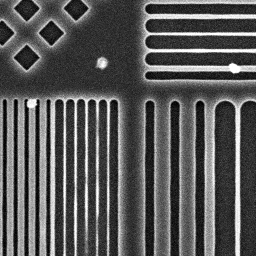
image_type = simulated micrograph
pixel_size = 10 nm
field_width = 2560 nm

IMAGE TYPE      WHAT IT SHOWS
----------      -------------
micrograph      groups of lines, slits or small figures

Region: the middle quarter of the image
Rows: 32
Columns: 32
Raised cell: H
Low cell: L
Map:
HHHHHHHHHHHHHHHHHHHHHHLLLLLLLLLL
HHHHHHHHHHHHHHHHHHHHHHHHHHHHHHHH
HHHHHHHHHHHHHHHHHHHHLLLLLLLLLLLL
HHHHHHHHHHHHHHHHHHHHLLLLLLLLLLLL
HHHHHHHHHHHHHHHHHHHHHHHHHHHHHHHH
HHHHHHHHHHHHHHHHHHHHHHHHHHHHHHHH
HHHHHHHHHHHHHHHHHHHHHHHHHHHHHHHH
HHHHHHHHHHHHHHHHHHHHHHHHHHHHHHHH
HHHHHHHHHHHHHHHHHHHHHHHHHHHHHHHH
LLLLLHLLLLLLLLHHHHHHHLLHHHHLLHHH
LLLLLLLLLLLLLLHHHHHHLLLHHHLLLHHH
LLLLLLLLLLLLLLHHHHHHLLLHHHLLLHHH
LLLLLLLLLLLLLLHHHHHHLLLHHHLLLHHH
LLLLLLLLLLLLLLHHHHHHLLLHHHLLLHHH
LLLLLLLLLLLLLLHHHHHHLLLHHHLLLHHH
LLLLLLLLLLLLLLHHHHHHLLLHHHLLLHHH
LLLLLLLLLLLLLLHHHHHHLLLHHHLLLHHH
LLLLLLLLLLLLLLHHHHHHLLLHHHLLLHHH
LLLLLLLLLLLLLLHHHHHHLLLHHHLLLHHH
LLLLLLLLLLLLLLHHHHHHLLLHHHLLLHHH
LLLLLLLLLLLLLLHHHHHHLLLHHHLLLHHH
LLLLLLLLLLLLLLHHHHHHLLLHHHLLLHHH
LLLLLLLLLLLLLLHHHHHHLLLHHHLLLHHH
LLLLLLLLLLLLLLHHHHHHLLLHHHLLLHHH
LLLLLLLLLLLLLLHHHHHHLLLHHHLLLHHH
LLLLLLLLLLLLLLHHHHHHLLLHHHLLLHHH
LLLLLLLLLLLLLLHHHHHHLLLHHHLLLHHH
LLLLLLLLLLLLLLHHHHHHLLLHHHLLLHHH
LLLLLLLLLLLLLLHHHHHHLLLHHHLLLHHH
LLLLLLLLLLLLLLHHHHHHLLLHHHLLLHHH
LLLLLLLLLLLLLLHHHHHHLLLHHHLLLHHH
LLLLLLLLLLLLLLHHHHHHLLLHHHLLLHHH